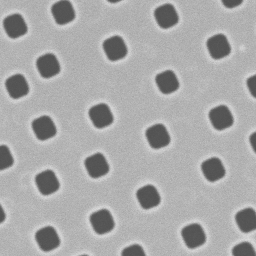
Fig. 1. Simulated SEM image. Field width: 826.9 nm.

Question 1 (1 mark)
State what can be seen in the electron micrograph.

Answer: a regular array of holes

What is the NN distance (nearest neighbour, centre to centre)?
0.169 µm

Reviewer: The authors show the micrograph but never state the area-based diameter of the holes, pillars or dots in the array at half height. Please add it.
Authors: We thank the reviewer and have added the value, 0.0801 µm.